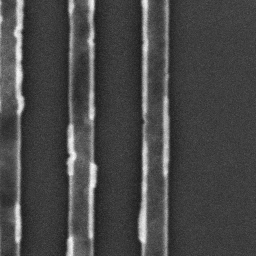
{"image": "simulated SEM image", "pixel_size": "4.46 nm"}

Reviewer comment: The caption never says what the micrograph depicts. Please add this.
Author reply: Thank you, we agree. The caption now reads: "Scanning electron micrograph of one or a few lines or trenches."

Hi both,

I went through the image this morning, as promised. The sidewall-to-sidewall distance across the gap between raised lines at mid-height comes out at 48.6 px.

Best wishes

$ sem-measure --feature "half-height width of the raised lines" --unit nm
110